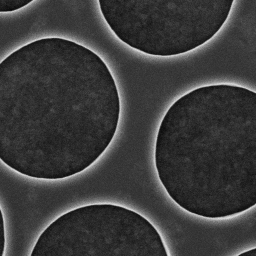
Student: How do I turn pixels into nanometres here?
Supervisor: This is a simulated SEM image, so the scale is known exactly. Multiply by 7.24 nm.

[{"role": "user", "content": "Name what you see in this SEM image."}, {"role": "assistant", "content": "holes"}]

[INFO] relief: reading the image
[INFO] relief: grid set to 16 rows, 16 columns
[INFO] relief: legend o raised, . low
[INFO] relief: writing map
.ooooo........oo
ooooooo.......oo
oo..oooo.....ooo
o.....oooooooooo
.......ooooooooo
.......ooooo...o
.......oooo.....
.......ooo......
.......ooo......
......oooo......
o....ooooo......
oooooooooo......
ooooooooooo.....
oooo.....oooo.oo
ooo.......oooooo
oo........oooooo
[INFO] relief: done